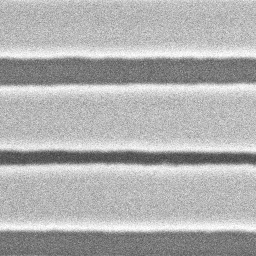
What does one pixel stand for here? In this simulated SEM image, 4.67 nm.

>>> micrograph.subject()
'lines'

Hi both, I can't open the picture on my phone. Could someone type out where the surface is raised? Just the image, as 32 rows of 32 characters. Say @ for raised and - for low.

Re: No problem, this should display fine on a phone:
@@@@@@@@@@@@@@@@@@@@@@@@@@@@@@@@
@@@@@@@@@@@@@@@@@@@@@@@@@@@@@@@@
@@@@@@@@@@@@@@@@@@@@@@@@@@@@@@@@
@@@@@@@@@@@@@@@@@@@@@@@@@@@@@@@@
@@@@@@@@@@@@@@@@@@@@@@@@@@@@@@@@
@@@@@@@@@@@@@@@@@@@@@@@@@@@@@@@@
@@@@@@@@@@@@@@@@@@@@@@@@@@@@@@@@
--------------------------------
--------------------------------
--------------------------------
--------------------------------
@@@@@@@@@@@@@@@@@@@@@@@@@@@@@@@@
@@@@@@@@@@@@@@@@@@@@@@@@@@@@@@@@
@@@@@@@@@@@@@@@@@@@@@@@@@@@@@@@@
@@@@@@@@@@@@@@@@@@@@@@@@@@@@@@@@
@@@@@@@@@@@@@@@@@@@@@@@@@@@@@@@@
@@@@@@@@@@@@@@@@@@@@@@@@@@@@@@@@
@@@@@@@@@@@@@@@@@@@@@@@@@@@@@@@@
@@@@@@@@@@@@@@@@@@@@@@@@@@@@@@@@
--------------------------------
--------------------------------
@@@@@@@@@@@@@@@@@@@@@@@@@@@@@@@@
@@@@@@@@@@@@@@@@@@@@@@@@@@@@@@@@
@@@@@@@@@@@@@@@@@@@@@@@@@@@@@@@@
@@@@@@@@@@@@@@@@@@@@@@@@@@@@@@@@
@@@@@@@@@@@@@@@@@@@@@@@@@@@@@@@@
@@@@@@@@@@@@@@@@@@@@@@@@@@@@@@@@
@@@@@@@@@@@@@@@@@@@@@@@@@@@@@@@@
@@@@@@@@@@@@@@@@@@@@@@@@@@@@@@@@
--------------------------------
--------------------------------
--------------------------------